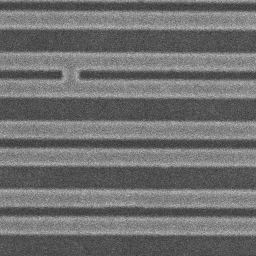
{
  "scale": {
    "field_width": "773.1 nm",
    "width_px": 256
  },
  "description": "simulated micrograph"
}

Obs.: parallel lines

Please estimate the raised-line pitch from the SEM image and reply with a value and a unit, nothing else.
104 nm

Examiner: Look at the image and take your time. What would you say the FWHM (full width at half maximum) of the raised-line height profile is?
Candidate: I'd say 52.5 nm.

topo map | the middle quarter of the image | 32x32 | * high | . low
********************************
****............................
****............................
****............................
********************************
********************************
********************************
********************************
................................
................................
................................
................................
................................
................................
**************************......
********************************
********************************
********************************
********************************
................................
................................
********************************
********************************
********************************
********************************
............................***.
................................
................................
................................
................................
................................
................................